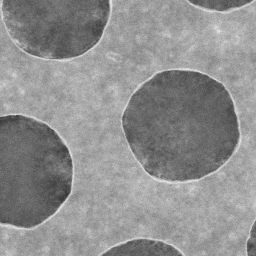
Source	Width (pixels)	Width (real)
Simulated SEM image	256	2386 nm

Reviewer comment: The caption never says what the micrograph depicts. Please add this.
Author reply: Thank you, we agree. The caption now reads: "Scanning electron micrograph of holes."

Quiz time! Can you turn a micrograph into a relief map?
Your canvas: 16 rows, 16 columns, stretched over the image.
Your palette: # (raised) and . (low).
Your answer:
.......######..#
.......#########
#.....##########
##...###########
##########..####
#########.....##
########.......#
..######.......#
....####.......#
....####.......#
.....####.....##
....############
....############
...#############
################
#######....####.